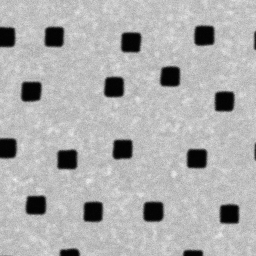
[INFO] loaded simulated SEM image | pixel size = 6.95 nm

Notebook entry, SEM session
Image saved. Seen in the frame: a regular array of holes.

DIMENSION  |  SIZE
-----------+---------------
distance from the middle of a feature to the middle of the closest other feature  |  396 nm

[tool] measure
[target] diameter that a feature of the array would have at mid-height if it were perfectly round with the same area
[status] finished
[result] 155 nanometers